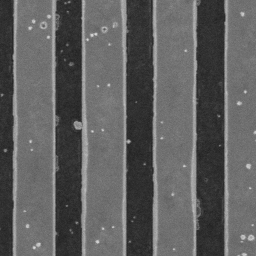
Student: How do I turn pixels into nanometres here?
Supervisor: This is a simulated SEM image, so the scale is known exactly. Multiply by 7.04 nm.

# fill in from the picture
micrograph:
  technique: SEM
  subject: lines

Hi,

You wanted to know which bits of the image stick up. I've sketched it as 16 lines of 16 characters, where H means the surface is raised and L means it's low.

LHHLLHHHLLHHLLHH
LHHLLHHHLLHHLLHH
LHHLLHHHLLHHLLHH
LHHLLHHHLLHHLLHH
LHHLLHHHLLHHLLHH
LHHLLHHHLLHHLLHH
LHHLLHHHLLHHLLHH
LHHLLHHHLLHHLLHH
LHHLLHHHLLHHLLHH
LHHLLHHHLLHHLLHH
LHHLLHHHLLHHLLHH
LHHLLHHHLLHHLLHH
LHHLLHHHLLHHLLHH
LHHLLHHHLLHHLLHH
LHHLLHHHLLHHLLHH
LHHLLHHHLLHHLLHH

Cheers